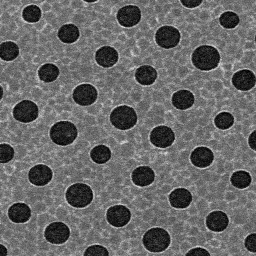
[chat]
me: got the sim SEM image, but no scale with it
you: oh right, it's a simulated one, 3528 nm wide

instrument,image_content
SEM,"a regular array of holes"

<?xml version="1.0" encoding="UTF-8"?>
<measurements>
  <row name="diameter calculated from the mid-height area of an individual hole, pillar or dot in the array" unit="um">0.318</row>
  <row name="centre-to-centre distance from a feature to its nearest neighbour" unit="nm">596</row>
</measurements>